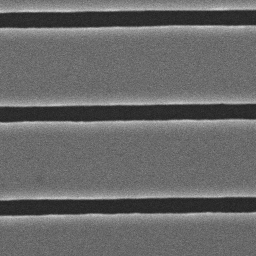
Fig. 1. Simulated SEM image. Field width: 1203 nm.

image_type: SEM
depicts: lines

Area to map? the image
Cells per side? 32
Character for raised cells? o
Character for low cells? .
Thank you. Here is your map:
oooooooooooooooooooooooooooooooo
o...............................
................................
o...o....ooooooooooooooooooooooo
oooooooooooooooooooooooooooooooo
oooooooooooooooooooooooooooooooo
oooooooooooooooooooooooooooooooo
oooooooooooooooooooooooooooooooo
oooooooooooooooooooooooooooooooo
oooooooooooooooooooooooooooooooo
oooooooooooooooooooooooooooooooo
oooooooooooooooooooooooooooooooo
oooooooooooooooooooooooooooooooo
................................
................................
oooooooooooooooooooooooooooooooo
oooooooooooooooooooooooooooooooo
oooooooooooooooooooooooooooooooo
oooooooooooooooooooooooooooooooo
oooooooooooooooooooooooooooooooo
oooooooooooooooooooooooooooooooo
oooooooooooooooooooooooooooooooo
oooooooooooooooooooooooooooooooo
oooooooooooooooooooooooooooooooo
oooooooooooooooooooooooooooooooo
................................
................................
oooooooooooooooooooooooooooooooo
oooooooooooooooooooooooooooooooo
oooooooooooooooooooooooooooooooo
oooooooooooooooooooooooooooooooo
oooooooooooooooooooooooooooooooo